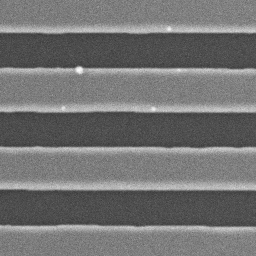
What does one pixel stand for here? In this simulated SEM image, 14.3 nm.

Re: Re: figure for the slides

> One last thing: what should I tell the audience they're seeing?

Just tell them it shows lines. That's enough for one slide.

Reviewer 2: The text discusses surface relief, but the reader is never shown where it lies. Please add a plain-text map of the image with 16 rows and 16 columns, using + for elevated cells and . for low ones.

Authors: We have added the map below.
++++++++++++++++
++++++++++++++++
................
................
++++++++++++++++
++++++++++++++++
++++++++++++++++
................
................
++++++++++++++++
++++++++++++++++
++++++++++++++++
................
................
++++++++++++++++
++++++++++++++++